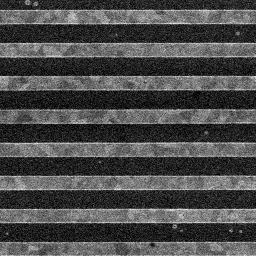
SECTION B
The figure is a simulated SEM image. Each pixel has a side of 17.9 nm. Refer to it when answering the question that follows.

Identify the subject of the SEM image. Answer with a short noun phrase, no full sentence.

parallel lines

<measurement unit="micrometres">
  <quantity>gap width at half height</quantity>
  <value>0.358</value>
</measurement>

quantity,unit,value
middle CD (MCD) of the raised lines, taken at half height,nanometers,237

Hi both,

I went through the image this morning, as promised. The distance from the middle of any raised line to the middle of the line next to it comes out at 0.594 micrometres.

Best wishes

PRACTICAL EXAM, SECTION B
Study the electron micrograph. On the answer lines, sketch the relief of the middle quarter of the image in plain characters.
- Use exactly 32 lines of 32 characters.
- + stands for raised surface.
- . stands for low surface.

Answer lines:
................................
................................
................................
++++++++++++++++++++++++++++++++
+++++++++++++++++.....++++++++++
+++++++++++++++++....+++++++++++
................................
................................
................................
................................
................................
................................
.+.+++++++++++++++++++++++++++++
++++++++++++++++++++++++++++++.+
++++++++++++++++++++++++++++++.+
................................
................................
................................
................................
................................
++++++++++++++++++.+++++++++++++
++++++++++++++++++++++++++++++++
++++++++++++++++++++++++++++++++
................................
................................
................................
................................
................................
++++++++++++++++++++++++++++++++
++.+++++++++++++++++++++++++++++
+++++++++.++++++++++++++++++++++
................................